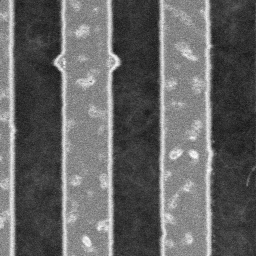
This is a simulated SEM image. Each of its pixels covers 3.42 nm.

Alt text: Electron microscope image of one or a few lines or trenches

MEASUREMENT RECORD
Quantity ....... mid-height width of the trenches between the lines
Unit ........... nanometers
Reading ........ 171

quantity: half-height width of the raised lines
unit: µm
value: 0.165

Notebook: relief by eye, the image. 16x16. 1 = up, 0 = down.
1000111000111000
1000111000111000
1000111000111000
1000111000111000
1000111000111000
1000111000111000
1000111000111000
1000111000111000
1000111000111000
1000111000111000
1000111000111000
1000111000111000
1000111000111000
1000111000111000
1000111000111000
1000111000111000